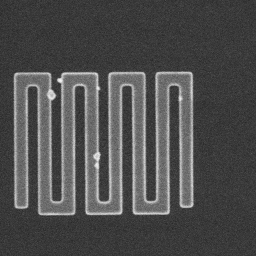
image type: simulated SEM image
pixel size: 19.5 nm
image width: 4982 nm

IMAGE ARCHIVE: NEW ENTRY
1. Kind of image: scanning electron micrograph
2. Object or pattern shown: groups of lines, slits or small figures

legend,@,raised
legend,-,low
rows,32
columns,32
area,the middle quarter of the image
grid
--------------------------------
--------------------------------
@@@@@@@@---@@@@@@@@@---@@@@@@@@@
@@@@@@@@---@@@@@@@@@---@@@@@@@@@
@@@@@@@@---@@@@@@@@@---@@@@@@@@@
@@@--@@@@--@@@@--@@@---@@@---@@@
@@@--@@@@--@@@---@@@---@@@---@@@
@@@--@@@---@@@---@@@---@@@---@@@
@@@--@@@---@@@---@@@---@@@---@@@
@@@--@@@---@@@---@@@---@@@---@@@
@@@--@@@---@@@---@@@---@@@---@@@
@@@--@@@---@@@---@@@---@@@---@@@
@@@--@@@---@@@---@@@---@@@---@@@
@@@--@@@---@@@---@@@---@@@---@@@
@@@--@@@---@@@---@@@---@@@---@@@
@@@--@@@---@@@---@@@---@@@---@@@
@@@--@@@---@@@---@@@---@@@---@@@
@@@--@@@@--@@@---@@@---@@@---@@@
@@@--@@@@--@@@---@@@---@@@---@@@
@@@--@@@@--@@@---@@@---@@@---@@@
@@@--@@@---@@@---@@@---@@@---@@@
@@@--@@@---@@@---@@@---@@@---@@@
@@@--@@@@--@@@---@@@---@@@---@@@
@@@--@@@@--@@@---@@@---@@@---@@@
@@@--@@@---@@@---@@@---@@@---@@@
@@@--@@@@--@@@----@@---@@@---@@@
@@@--@@@---@@@----@@---@@@---@@@
@@@--@@@---@@@----@@---@@@---@@@
@@@--@@@---@@@----@@---@@@---@@@
@@@--@@@---@@@----@@---@@@---@@@
@@@---@@---@@@----@@---@@@---@@@
@@@---@@---@@@----@@---@@@---@@@